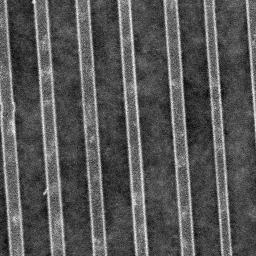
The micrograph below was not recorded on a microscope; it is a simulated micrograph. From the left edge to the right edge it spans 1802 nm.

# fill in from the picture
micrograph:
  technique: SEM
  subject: parallel lines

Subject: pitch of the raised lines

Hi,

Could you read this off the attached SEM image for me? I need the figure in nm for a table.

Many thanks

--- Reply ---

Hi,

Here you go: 295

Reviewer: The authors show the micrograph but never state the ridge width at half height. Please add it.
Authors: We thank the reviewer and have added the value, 0.086 microns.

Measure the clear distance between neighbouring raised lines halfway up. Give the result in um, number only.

0.203